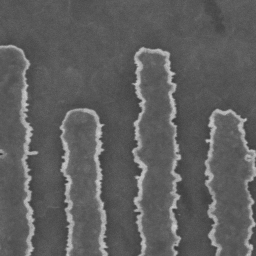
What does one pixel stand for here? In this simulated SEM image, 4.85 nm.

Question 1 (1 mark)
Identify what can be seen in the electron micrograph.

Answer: one or a few lines or trenches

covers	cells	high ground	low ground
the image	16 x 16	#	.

................
................
................
#........#......
##.......##.....
##.......##.....
##.......##.....
##..##...##..##.
##..##...##..##.
##..##..###..###
##..##...##..###
##..##...##..###
##..##...##..###
##..###..##..###
##..###..##..###
##..###..##..###